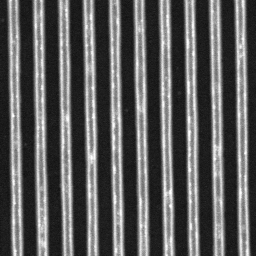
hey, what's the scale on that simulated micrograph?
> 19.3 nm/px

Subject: parallel lines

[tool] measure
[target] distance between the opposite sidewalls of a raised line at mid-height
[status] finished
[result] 169 nanometres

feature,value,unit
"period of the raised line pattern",486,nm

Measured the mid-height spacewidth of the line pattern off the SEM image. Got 0.321 micrometres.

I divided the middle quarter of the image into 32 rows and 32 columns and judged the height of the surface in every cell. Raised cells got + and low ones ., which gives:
+....++.....++....++....++.....+
+....++.....++....++....++.....+
+....++.....++....++....++.....+
+....++.....++....++....++.....+
+....++.....++....++....+++....+
+....++.....++....++....+++....+
+.....+.....++....++....+++....+
+.....+.....++....++....+++....+
+.....++....++....++....+++....+
+.....++....++....++....+++....+
+.....++....++....++....+++....+
+.....++....++....++....+++....+
+.....++....++....++....+++....+
+.....++....++....++....+++....+
+.....++....++....++.....+.....+
+.....++....++....++.....+.....+
+.....++....++....++.....+.....+
+.....++....++....++.....++....+
+.....++....++....++.....++....+
+.....++....++....++.....++....+
+.....++....++....++.....++....+
+.....++....++....++.....++....+
+.....++....++.....+.....++....+
+.....++....++.....+.....++....+
+.....++....++.....+.....++....+
++....++....++.....++....++....+
++....++....++.....++....++....+
++....++....++.....++....++....+
++....++....++.....++....++....+
++....++....++.....++....++....+
++....++....++.....++....++....+
++....++....++.....++....++....+